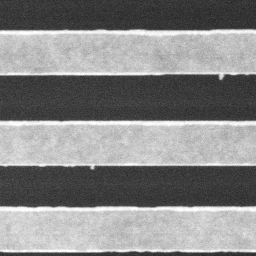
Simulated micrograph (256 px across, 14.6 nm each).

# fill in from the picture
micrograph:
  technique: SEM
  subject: lines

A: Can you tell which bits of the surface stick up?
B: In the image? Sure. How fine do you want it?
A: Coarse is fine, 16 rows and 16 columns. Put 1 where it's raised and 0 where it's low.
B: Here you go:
0000000000000000
0000000000000000
1111111111111111
1111111111111111
1111111111111111
0000000000000000
0000000000000000
0000000000000000
1111111111111111
1111111111111111
0000000000000000
0000000000000000
0000000000000000
1111111111111111
1111111111111111
1111111111111111